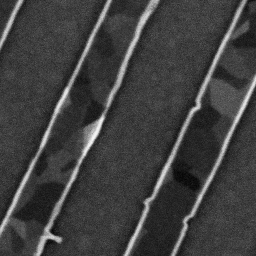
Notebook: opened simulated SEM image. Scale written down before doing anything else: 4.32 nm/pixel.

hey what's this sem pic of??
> one or a few lines or trenches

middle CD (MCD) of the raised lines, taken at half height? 186 nm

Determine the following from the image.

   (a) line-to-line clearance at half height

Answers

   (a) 346 nanometers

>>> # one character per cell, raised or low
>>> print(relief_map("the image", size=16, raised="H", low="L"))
HLLLLLLHHLLLLLLH
HLLLLLHHHLLLLLLH
LLLLLLHHLLLLLLHH
LLLLLHHHLLLLLLHH
LLLLLHHHLLLLLHHH
LLLLHHHLLLLLLHHH
LLLLHHHLLLLLHHHL
LLLHHHLLLLLLHHHL
LLLHHHLLLLLHHHLL
LLHHHLLLLLLHHHLL
LLHHHLLLLLHHHLLL
LHHHLLLLLLHHHLLL
LHHHLLLLLHHHLLLL
HHHLLLLLLHHHLLLL
HHHLLLLLLHHLLLLL
HHHLLLLLHHHLLLLL